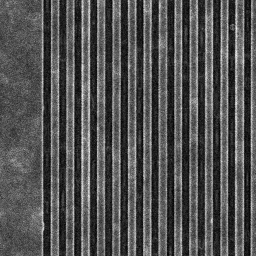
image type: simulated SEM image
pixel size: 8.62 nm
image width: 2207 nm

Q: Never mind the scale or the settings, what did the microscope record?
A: parallel lines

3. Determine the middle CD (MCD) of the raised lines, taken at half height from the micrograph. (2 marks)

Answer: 69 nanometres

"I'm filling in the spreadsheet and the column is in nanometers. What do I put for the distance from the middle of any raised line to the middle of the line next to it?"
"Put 133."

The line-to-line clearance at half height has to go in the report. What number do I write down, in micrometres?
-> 0.069